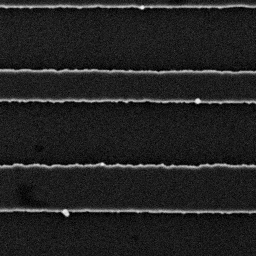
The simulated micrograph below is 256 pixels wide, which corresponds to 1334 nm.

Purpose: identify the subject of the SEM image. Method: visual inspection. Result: lines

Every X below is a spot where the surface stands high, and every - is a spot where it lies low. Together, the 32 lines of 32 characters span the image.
XXXXXXXXXXXXXXXXXXXXXXXXXXXXXXXX
--------------------------------
--------------------------------
--------------------------------
--------------------------------
--------------------------------
--------------------------------
--------------------------------
--------------------------------
XXXXXXXXXXXXXXXXXXXXXXXXXXXXXXXX
XXXXXXXXXXXXXXXXXXXXXXXXXXXXXXXX
XXXXXXXXXXXXXXXXXXXXXXXXXXXXXXXX
XXXXXXXXXXXXXXXXXXXXXXXXXXXXXXXX
--------------------------------
--------------------------------
--------------------------------
--------------------------------
--------------------------------
--------------------------------
--------------------------------
------------X-------------------
XXXXXXXXXXXXXXXXXXXXXXXXXXXXXXXX
XXXXXXXXXXXXXXXXXXXXXXXXXXXXXXXX
XXXXXXXXXXXXXXXXXXXXXXXXXXXXXXXX
XXXXXXXXXXXXXXXXXXXXXXXXXXXXXXXX
XXXXXXXXXXXXXXXXXXXXXXXXXXXXXXXX
-------XX-----X--XXXXXXXXXXXXXXX
--------------------------------
--------------------------------
--------------------------------
--------------------------------
--------------------------------